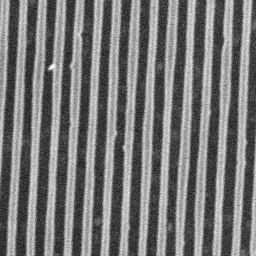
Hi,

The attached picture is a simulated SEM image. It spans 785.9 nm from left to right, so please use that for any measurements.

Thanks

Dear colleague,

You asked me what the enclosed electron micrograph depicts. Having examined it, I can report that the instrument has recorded parallel lines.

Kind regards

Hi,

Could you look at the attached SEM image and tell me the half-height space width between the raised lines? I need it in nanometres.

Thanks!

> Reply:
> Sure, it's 35.3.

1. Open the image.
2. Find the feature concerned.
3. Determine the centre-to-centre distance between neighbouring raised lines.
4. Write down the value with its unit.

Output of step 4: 57.3 nanometers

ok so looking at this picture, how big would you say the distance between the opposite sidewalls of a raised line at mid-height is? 20.7 nanometers